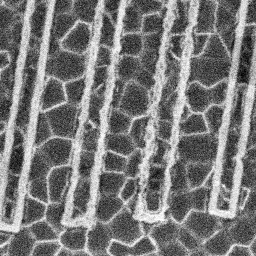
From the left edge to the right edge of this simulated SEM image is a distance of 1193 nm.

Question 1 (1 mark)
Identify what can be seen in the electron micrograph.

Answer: one or a few lines or trenches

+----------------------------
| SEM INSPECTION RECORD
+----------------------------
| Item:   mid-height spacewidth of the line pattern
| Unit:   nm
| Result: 222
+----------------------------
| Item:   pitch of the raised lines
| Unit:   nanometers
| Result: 329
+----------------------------